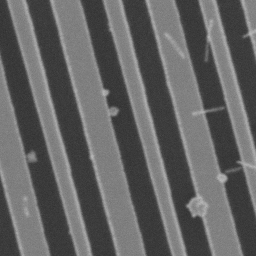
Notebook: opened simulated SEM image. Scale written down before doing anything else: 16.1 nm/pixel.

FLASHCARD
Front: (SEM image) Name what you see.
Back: lines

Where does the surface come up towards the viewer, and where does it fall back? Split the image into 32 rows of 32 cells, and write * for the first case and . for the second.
.**...****...**...****...**...**
.***...***...**....***...**....*
..**...****...**...****..***...*
..**...****...**...****...**...*
..**....***...**...****...**...*
..***...***...***...***...**....
...**...****...**...***....**...
...**...****...**...****...**...
...**...****...**...****...**...
*..***...****..***...***...***..
*...**...****...**...****...**..
*...**...****...**...****...**..
*...**....***...**....***...**..
**...**...***....**...***...***.
**...**...****...**...****...**.
**...**...****...**...****...**.
**...***...***...**....***...**.
***...**...****...**...***....**
***...**...****...**...****...**
***...**...****...**...****...**
***....**...***...**....***...**
****...**...***....**...****...*
****...**...****...**...****...*
****...**...****...**...****...*
.***....**...***....*...****...*
.****...**...****...**..*****...
.****...**...****...**..*****...
..***...**...****...**...****...
..***....**...***....*....***...
..****...**...****...**...****..
..****...**...****...**...****..
...***....*....***...**...****..